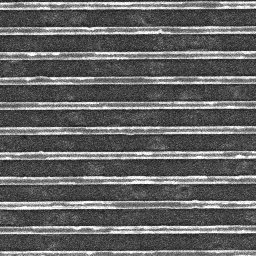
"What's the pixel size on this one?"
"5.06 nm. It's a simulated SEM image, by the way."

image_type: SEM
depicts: parallel lines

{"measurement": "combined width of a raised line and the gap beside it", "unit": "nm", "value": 126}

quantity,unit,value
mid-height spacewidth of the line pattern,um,0.0904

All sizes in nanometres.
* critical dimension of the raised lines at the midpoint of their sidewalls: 36